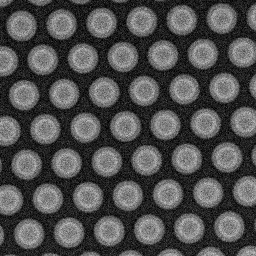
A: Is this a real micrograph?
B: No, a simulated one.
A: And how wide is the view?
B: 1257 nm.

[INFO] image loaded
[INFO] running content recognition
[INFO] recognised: an array of small figures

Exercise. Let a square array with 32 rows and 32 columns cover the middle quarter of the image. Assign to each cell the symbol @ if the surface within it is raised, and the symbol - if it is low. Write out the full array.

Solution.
--@@@@@@----@@@@@@----@@@@@-----
--@@@@@------@@@@---------------
--------------------------------
---------@@-------@@@@------@@@@
@@-----@@@@@@----@@@@@@----@@@@@
@@@----@@@@@@----@@@@@@@--@@@@@@
@@@@--@@@@@@@@--@@@@@@@@--@@@@@@
@@@@--@@@@@@@@--@@@@@@@@---@@@@@
@@@@---@@@@@@@---@@@@@@----@@@@@
@@@----@@@@@@-----@@@@@-----@@@@
@@-------@@@--------------------
--------------------------------
----@@@------@@@@------@@@@@----
--@@@@@@----@@@@@@----@@@@@@@---
--@@@@@@@---@@@@@@@---@@@@@@@---
--@@@@@@@---@@@@@@@---@@@@@@@---
--@@@@@@@---@@@@@@@---@@@@@@@---
--@@@@@@@---@@@@@@@---@@@@@@----
---@@@@@-----@@@@@------@@@-----
----@@--------------------------
--------------------@@-------@@@
@@-------@@@@-----@@@@@-----@@@@
@@@@----@@@@@@---@@@@@@@---@@@@@
@@@@---@@@@@@@---@@@@@@@---@@@@@
@@@@---@@@@@@@---@@@@@@@---@@@@@
@@@@---@@@@@@@---@@@@@@@---@@@@@
@@@@----@@@@@@----@@@@@@----@@@@
@@@------@@@@------@@@----------
--------------------------------
---------------@@-------@@@@----
----@@@@-----@@@@@@----@@@@@@---
---@@@@@@----@@@@@@---@@@@@@@@--